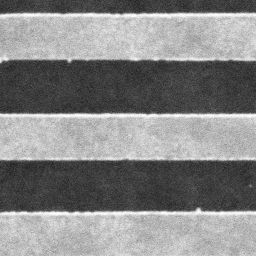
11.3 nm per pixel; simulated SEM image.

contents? lines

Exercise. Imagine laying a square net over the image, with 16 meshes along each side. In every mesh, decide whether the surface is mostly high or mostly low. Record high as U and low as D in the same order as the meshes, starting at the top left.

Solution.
DDDDDDDDDDDDDDDD
UUUUUUUUUUUUUUUU
UUUUUUUUUUUUUUUU
UUUUUUUUUUUUUUUU
DDDDDDDDDDDDDDDD
DDDDDDDDDDDDDDDD
DDDDDDDDDDDDDDDD
UUUUUUUUUUUUUUUU
UUUUUUUUUUUUUUUU
UUUUUUUUUUUUUUUU
DDDDDDDDDDDDDDDD
DDDDDDDDDDDDDDDD
DDDDDDDDDDDDDDDD
UUUUUUUUUUUUUUUU
UUUUUUUUUUUUUUUU
UUUUUUUUUUUUUUUU